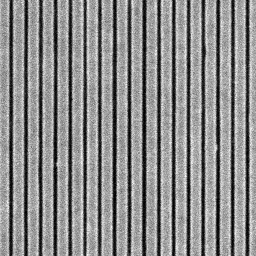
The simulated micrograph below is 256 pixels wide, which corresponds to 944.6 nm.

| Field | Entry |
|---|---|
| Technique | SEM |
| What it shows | parallel lines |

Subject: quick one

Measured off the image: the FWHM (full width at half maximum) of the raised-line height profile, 9.86 px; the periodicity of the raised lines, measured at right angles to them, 54.5 nanometres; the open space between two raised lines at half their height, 4.5 px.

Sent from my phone